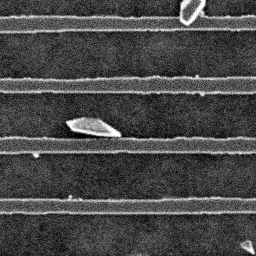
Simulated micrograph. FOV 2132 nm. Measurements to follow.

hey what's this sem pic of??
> lines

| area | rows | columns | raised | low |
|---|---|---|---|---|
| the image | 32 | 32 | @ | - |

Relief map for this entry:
-----------------------@@@------
-----------------------@@-------
@@@@@@@@@@@@@@@@@@@@@@@@@@@@@@@@
@@@@@@@@@@@@@@@@@@@@@@@@@@@@@@@@
--------------------------------
--------------------------------
--------------------------------
--------------------------------
--------------------------------
--------------------------------
@@@@@@@@@@@@@@@@@@@@@@@@@@@@@@@@
@@@@@@@@@@@@@@@@@@@@@@@@@@@@@@@@
--------------------------------
--------------------------------
--------------------------------
---------@@@@-------------------
----------@@@@@-----------------
@@@@@@@@@@@@@@@@@@@@@@@@@@@@@@@@
@@@@@@@@@@@@@@@@@@@@@@@@@@@@@@@@
--------------------------------
--------------------------------
--------------------------------
--------------------------------
--------------------------------
--------------------------------
@@@@@@@@@@@@@@@@@@@@@@@@@@@@@@@@
@@@@@@@@@@@@@@@@@@@@@@@@@@@@@@@@
--------------------------------
--------------------------------
--------------------------------
--------------------------------
--------------------------------